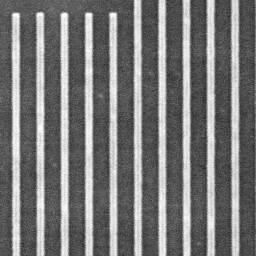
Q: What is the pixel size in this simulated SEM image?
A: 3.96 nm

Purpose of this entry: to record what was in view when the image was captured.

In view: parallel lines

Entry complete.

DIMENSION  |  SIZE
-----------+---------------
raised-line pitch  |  96.5 nm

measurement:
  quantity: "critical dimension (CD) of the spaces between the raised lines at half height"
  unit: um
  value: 0.0743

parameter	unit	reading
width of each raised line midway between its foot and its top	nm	21.3